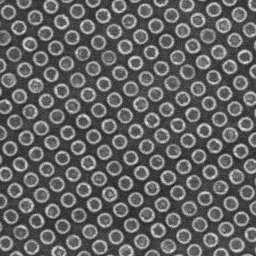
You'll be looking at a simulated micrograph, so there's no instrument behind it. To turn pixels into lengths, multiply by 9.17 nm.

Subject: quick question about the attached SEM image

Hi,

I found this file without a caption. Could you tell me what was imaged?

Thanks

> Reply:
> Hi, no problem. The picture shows a regular array of raised bodies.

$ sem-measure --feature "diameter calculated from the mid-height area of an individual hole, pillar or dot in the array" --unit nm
128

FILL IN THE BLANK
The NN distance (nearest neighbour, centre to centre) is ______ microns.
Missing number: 0.169